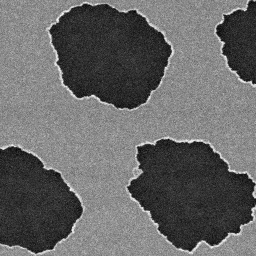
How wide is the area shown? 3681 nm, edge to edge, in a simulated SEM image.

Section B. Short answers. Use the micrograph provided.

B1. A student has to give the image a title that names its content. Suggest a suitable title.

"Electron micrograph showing holes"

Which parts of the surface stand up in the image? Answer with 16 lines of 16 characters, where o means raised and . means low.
ooooo..oooooooo.
ooo......ooooo..
ooo.......oooo..
oooo.......ooo..
oooo......ooooo.
oooo......oooooo
ooooooo..ooooooo
oooooooooooooooo
oooooooooooooooo
..ooooooo.....oo
...oooooo.....oo
....oooo........
.....ooo........
.....oooo.......
....oooooo.....o
o..oooooooo.oooo